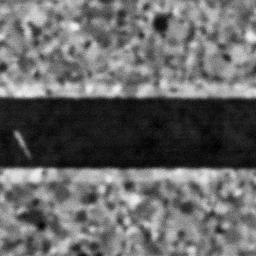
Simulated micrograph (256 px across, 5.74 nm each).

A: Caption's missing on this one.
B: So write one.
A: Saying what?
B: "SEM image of one or a few lines or trenches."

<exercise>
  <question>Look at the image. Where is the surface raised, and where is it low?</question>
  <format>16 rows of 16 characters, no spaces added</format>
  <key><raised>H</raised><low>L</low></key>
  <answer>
HHHHHHHHHHHHHHHH
HHHHHHHHHHHHHHHH
HHHHHHHHHHHHHHHH
HHHHHHHHHHHHHHHH
HHHHHHHHHHHHHHHH
HHHHHHHHHHHHHHHH
LLLLLLLLLLLLLLLL
LLLLLLLLLLLLLLLL
LLLLLLLLLLLLLLLL
LLLLLLLLLLLLLLLL
LLLLLLLLLLLLLLLL
HHHHHHHHHHHHHHHH
HHHHHHHHHHHHHHHH
HHHHHHHHHHHHHHHH
HHHHHHHHHHHHHHHH
HHHHHHHHHHHHHHHH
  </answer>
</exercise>